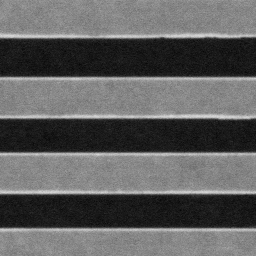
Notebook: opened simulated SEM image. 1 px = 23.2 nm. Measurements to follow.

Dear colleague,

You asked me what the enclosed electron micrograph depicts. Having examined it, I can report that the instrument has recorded lines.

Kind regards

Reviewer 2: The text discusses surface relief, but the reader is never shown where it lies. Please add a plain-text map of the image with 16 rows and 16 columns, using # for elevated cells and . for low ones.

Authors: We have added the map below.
################
################
................
................
................
################
################
................
................
................
################
################
................
................
################
################